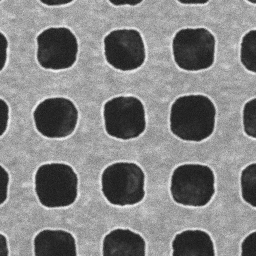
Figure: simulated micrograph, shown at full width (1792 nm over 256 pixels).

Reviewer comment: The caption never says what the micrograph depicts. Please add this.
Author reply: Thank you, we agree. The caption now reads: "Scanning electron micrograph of a regular array of holes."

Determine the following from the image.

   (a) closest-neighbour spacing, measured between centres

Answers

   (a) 471 nm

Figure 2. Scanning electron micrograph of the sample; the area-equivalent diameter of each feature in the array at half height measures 314 nanometers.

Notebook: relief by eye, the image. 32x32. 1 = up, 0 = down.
11111100111111000111111000111111
11111111111111111111111111111111
11111111111111111111111111111111
11111100111111111111111111111111
01111000011110000011110000011100
01111000001110000011110000011100
01111000001110000011110000011100
01111000011110000011110000011100
11111000011111000111111000111110
11111111111111111111111111111111
11111111111111111111111111111111
11111111111111111111111111111111
11111100011111000111110000111110
01110000001110000011100000011100
01110000001110000011100000011100
01110000001110000011100000011100
01111000011110000011110000011110
11111111111111101111111001111111
11111111111111111111111111111111
11111111111111111111111111111111
11111100111111000111111001111110
01110000011110000011110000011100
01110000001110001011100000011100
01110000001110001011100000011100
01111000001110000011110000011100
11111000011111000111110000111110
11111111111111111111111111111111
11111111111111111111111111111111
11111111111111111111111111111111
11110000011110000011110000111110
01110000011110000011100000011100
01110000001110000011100000011100